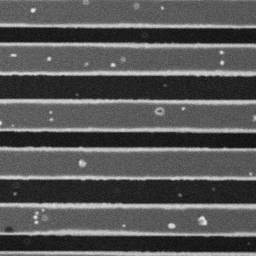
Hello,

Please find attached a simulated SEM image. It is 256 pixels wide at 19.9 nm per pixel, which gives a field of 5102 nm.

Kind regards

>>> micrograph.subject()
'lines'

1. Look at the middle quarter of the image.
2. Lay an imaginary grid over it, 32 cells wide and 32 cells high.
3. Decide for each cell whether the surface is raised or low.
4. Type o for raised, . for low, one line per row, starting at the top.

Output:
oooooooooooooooooooooooooooooooo
oooooooooooooooooooooooooooooooo
oooooooooooooooooooooooooooooooo
................................
................................
................................
................................
................................
................................
oooooooooooooooooooooooooooooooo
oooooooooooooooooooooooooooooooo
oooooooooooooooooooooooooooooooo
oooooooooooooooooooooooooooooooo
oooooooooooooooooooooooooooooooo
oooooooooooooooooooooooooooooooo
oooooooooooooooooooooooooooooooo
oooooooooooooooooooooooooooooooo
................................
................................
................................
................................
oooooooooooooooooooooooooooooooo
oooooooooooooooooooooooooooooooo
oooooooooooooooooooooooooooooooo
oooooooooooooooooooooooooooooooo
oooooooooooooooooooooooooooooooo
oooooooooooooooooooooooooooooooo
oooooooooooooooooooooooooooooooo
oooooooooooooooooooooooooooooooo
................................
................................
................................